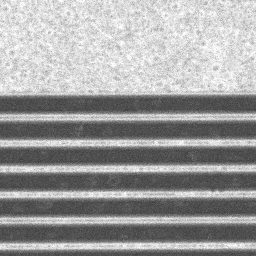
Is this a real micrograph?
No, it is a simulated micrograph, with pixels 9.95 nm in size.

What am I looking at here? parallel lines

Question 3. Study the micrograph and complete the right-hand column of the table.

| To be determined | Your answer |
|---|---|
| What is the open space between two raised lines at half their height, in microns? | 0.172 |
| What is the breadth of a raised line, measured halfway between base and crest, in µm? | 0.0808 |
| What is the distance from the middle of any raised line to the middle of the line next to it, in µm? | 0.256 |